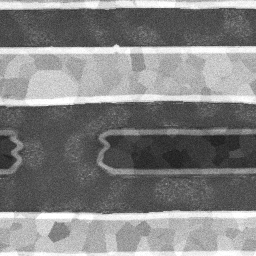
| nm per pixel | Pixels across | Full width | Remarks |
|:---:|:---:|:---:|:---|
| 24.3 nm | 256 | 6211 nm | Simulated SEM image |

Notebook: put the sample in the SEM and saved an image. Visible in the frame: one or a few lines or trenches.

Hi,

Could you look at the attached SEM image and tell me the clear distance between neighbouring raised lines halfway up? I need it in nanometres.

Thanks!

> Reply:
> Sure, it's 1090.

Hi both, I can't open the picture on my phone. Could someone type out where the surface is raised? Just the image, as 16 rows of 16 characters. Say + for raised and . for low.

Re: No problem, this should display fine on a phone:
................
................
................
++++++++++++++++
++++++++++++++++
++++++++++++++++
................
................
+......+++++++++
+.....++++++++++
+......+++++++++
................
................
+++++.....++++++
++++++++++++++++
++++++++++++++++